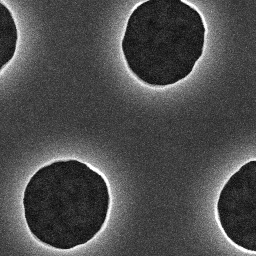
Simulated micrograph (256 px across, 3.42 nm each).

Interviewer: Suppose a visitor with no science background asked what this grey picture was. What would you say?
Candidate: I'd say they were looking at holes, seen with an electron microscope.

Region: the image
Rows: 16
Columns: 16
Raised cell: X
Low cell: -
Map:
XXXXXXXXX---XXXX
-XXXXXXX-----XXX
-XXXXXXX-----XXX
-XXXXXXX----XXXX
XXXXXXXX----XXXX
XXXXXXXXXXXXXXXX
XXXXXXXXXXXXXXXX
XXXXXXXXXXXXXXXX
XXXXXXXXXXXXXXXX
XXXXXXXXXXXXXXXX
XXX---XXXXXXXXX-
XX-----XXXXXXX--
XX-----XXXXXXX--
XX-----XXXXXXX--
XX----XXXXXXXX--
XXXXXXXXXXXXXXX-